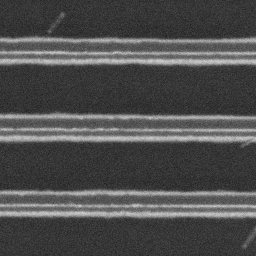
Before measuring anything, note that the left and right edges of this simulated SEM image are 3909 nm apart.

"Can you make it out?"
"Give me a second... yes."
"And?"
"lines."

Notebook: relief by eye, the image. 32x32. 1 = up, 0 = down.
00000000000000000000000000000000
00000000000000000000000000000000
00000000000000000000000000000000
00000000000000000000000000000000
00000000000000000000000000000000
11111111111111111111111111111111
11111111111111111111111111111111
00000111111000110111111111111111
00000000000000000000000000000000
00000000000000000000000000000000
00000000000000000000000000000000
00000000000000000000000000000000
00000000000000000000000000000000
00000000000000000000000000000000
00000000000000000000000000000000
11111111111111111111111111111111
11111111111111111111111111111111
00000000000000000000000000000000
00000000000000000000000000000000
00000000000000000000000000000000
00000000000000000000000000000000
00000000000000000000000000000000
00000000000000000000000000000000
00000000000000000000000000000000
11111111111111111111111111111111
11111111111111111111111111111111
11111111111111111111111111111111
00000000000000000000000000000000
00000000000000000000000000000000
00000000000000000000000000000000
00000000000000000000000000000000
00000000000000000000000000000000